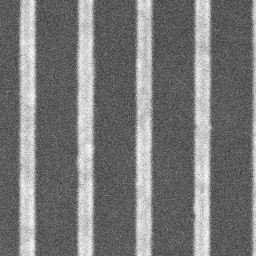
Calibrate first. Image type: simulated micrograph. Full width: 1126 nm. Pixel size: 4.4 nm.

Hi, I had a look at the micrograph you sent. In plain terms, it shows parallel lines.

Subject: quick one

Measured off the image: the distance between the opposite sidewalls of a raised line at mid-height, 52.8 nm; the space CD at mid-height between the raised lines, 204 nanometers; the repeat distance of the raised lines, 256 nm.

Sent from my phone